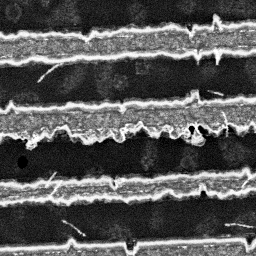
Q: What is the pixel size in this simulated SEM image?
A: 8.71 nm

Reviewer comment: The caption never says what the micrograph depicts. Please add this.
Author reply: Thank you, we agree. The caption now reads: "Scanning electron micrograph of one or a few lines or trenches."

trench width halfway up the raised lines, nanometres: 408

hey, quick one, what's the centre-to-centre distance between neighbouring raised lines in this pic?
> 629 nanometres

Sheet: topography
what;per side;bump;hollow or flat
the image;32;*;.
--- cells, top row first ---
................................
................................
................................
....................**..********
..********.*********************
********************************
****************************.**.
****..**........................
................................
................................
................................
................................
.......................**....***
.*.....*************************
********************************
********************************
*******..*******...*.****.......
...**.....*.*.*.........*.......
................................
................................
................................
..............................*.
............*..***.*************
********************************
********************..*.........
................................
................................
................................
................................
................................
........**........*************.
********************************